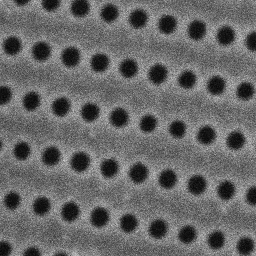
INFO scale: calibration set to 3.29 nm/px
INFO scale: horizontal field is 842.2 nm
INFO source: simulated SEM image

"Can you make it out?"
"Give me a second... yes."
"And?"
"a regular array of holes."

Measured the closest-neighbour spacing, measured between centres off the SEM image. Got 97.3 nanometers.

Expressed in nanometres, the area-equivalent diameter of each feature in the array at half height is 63.1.